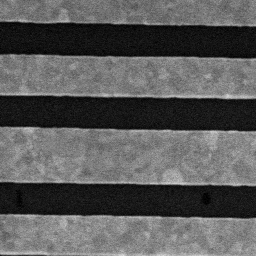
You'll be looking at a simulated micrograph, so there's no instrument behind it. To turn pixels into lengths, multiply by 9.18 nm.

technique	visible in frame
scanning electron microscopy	lines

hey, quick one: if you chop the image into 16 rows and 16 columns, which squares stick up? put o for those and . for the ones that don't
oooooooooooooooo
.........ooooooo
................
oooo............
oooooooooooooooo
oooooooooooooooo
................
................
oooooooooooooooo
oooooooooooooooo
oooooooooooooooo
...........ooooo
................
ooooooo.........
oooooooooooooooo
oooooooooooooooo